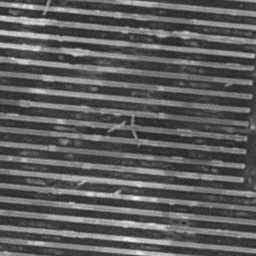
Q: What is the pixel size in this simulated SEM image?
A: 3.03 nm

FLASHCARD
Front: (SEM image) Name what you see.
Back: parallel lines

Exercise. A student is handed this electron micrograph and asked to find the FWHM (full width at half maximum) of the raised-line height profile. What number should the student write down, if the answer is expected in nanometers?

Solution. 11.7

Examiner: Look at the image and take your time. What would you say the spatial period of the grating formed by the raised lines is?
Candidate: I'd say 41.9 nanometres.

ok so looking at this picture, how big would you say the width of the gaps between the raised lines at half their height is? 0.029 um